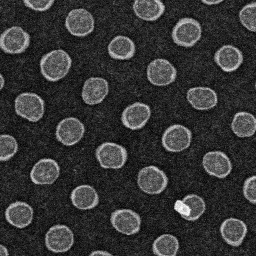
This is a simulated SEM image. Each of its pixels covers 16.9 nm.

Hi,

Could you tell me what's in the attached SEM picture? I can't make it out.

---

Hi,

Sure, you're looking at a regular array of raised bodies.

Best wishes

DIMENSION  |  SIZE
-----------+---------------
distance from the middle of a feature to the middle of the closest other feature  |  0.794 micrometres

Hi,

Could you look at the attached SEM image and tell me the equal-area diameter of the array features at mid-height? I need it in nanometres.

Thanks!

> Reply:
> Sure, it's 443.